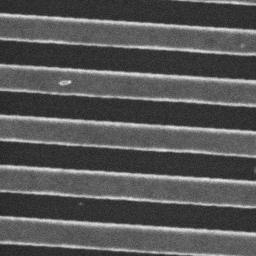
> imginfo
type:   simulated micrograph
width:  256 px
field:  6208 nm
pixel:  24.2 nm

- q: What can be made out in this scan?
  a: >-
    lines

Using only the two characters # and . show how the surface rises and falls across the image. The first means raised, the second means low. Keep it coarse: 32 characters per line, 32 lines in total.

..............................##
................................
############....................
###########################.....
################################
.........#######################
.........................#######
................................
#######.........................
######################..........
################################
...#############################
...................#############
................................
##..............................
#################...............
################################
################################
...............#################
..............................##
................................
#############...................
#############################...
################################
.........#######################
........................########
................................
######..........................
######################..........
################################
..##############################
.................###############